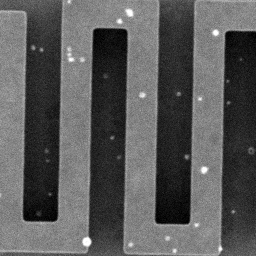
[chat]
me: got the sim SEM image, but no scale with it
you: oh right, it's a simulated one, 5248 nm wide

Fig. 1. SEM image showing groups of lines, slits or small figures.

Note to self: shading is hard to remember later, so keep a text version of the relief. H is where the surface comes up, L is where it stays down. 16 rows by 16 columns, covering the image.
LLLLHHHHHHLLHHHH
HHLLHHHHHHLLHHHH
HHLLHHLLHHLLHHLL
HHLLHHLLHHLLHHLL
HHLLHHLLHHLLHHLL
HHLLHHLLHHLLHHLL
HHLLHHLLHHLLHHLL
HLLLHHLLHHLLHHLL
HLLLHHLLHHLLHHLL
HLLLHHLLHHLLHHLL
HLLLHHLLHHLLHHLL
HLLLHHLLHHLLHHLL
HLLLHHLLHHLLHHLL
HLLLHHLLHHLLHHLL
HHHHHHLLHHHHHHLL
HHHHHLLLHHHHHHLL